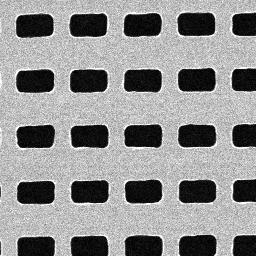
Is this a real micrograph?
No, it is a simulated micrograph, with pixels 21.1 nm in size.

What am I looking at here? a regular array of holes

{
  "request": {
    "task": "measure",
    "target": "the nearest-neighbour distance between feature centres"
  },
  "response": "1.13 um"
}